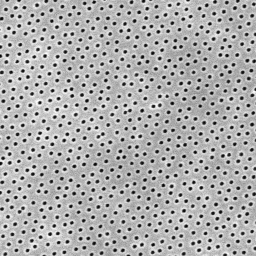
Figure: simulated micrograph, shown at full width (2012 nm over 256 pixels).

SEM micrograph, a regular array of holes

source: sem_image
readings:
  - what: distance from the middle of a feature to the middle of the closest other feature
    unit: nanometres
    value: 68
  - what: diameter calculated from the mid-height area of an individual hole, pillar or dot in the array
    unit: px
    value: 3.74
